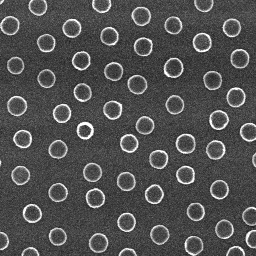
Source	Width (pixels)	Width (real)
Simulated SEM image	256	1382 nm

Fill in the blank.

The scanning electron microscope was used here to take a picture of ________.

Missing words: a regular array of raised bodies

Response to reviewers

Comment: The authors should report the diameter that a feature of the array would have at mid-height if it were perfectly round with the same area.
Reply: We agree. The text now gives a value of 99.4 nanometres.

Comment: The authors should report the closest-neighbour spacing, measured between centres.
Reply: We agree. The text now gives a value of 0.172 um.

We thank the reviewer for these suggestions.